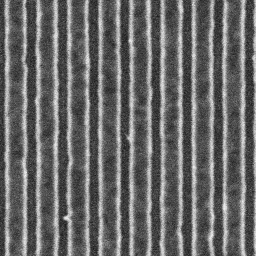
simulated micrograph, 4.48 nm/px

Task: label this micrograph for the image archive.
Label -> parallel lines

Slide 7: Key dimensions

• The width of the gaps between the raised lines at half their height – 58.2 nanometers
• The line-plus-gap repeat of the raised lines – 139 nm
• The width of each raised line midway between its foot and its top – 83.4 nm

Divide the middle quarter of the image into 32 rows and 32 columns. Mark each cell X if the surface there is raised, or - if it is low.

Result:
-XXXXX---XXXXX---XXXX----XXXX---
--XXXX---XXXXX---XXXX----XXXX---
--XXXX---XXXXX---XXXX----XXXX---
--XXXX---XXXXX---XXXX----XXXX---
-XXXXX---XXXXX---XXXX----XXXX---
-XXXXX---XXXXX---XXXX----XXXX---
-XXXXX---XXXXX---XXXXX---XXXX---
-XXXXX---XXXXX---XXXXX---XXXX---
-XXXXX---XXXXX---XXXX----XXXX---
-XXXXX---XXXXX---XXXX----XXXX---
-XXXXX---XXXXX---XXXX----XXXX---
-XXXXX---XXXXX---XXXX----XXXX---
-XXXXX---XXXXX---XXXX----XXXX---
--XXXX---XXXX----XXXX----XXXX---
--XXXX---XXXX----XXXX---XXXXX---
-XXXXX---XXXXX---XXXX----XXXX---
-XXXXX---XXXXX---XXXX---XXXXX---
-XXXXX---XXXXX---XXXX---XXXXX---
-XXXXX---XXXXX---XXXX----XXXX---
-XXXXX---XXXXX---XXXX----XXXX---
-XXXXX---XXXXX---XXXX----XXXX---
-XXXXX---XXXXX---XXXX----XXXX---
-XXXXX---XXXXX---XXXX----XXXX---
--XXXX---XXXXX---XXXX----XXXX---
--XXXX---XXXXX---XXXX----XXXX---
-XXXXX---XXXXX---XXXX----XXXX---
-XXXXX---XXXXX---XXXX----XXXX---
-XXXXX---XXXXX---XXXX----XXXX---
-XXXXX---XXXXX---XXXX----XXXX---
-XXXXX---XXXXX---XXXX----XXXX---
-XXXXX---XXXXX---XXXX----XXXX---
-XXXXX---XXXXX---XXXX----XXXX---